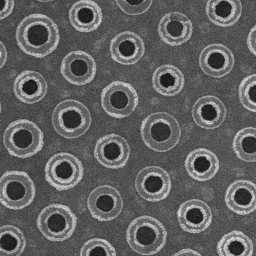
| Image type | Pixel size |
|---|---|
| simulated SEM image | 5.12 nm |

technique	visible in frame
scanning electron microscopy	a regular array of ring-shaped raised bodies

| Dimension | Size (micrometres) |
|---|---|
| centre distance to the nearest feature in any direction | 0.264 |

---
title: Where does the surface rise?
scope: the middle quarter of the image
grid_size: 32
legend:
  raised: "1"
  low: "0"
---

11000011000000000000000011100000
11000011000000000000000111111000
11000111000000000000001110011000
11111110000000000000001100001100
00111100000001000000001100001100
00000000000111111000001110011100
00000000001111111100000111111000
00000000011100011100000011110000
00000000011100001100000000000000
11100000011100001100000000000000
11111000001100001100000000000000
11111100001111111000000000000000
00001100000111111000001111000000
00001110000000000000011111110000
00001110000000000000111111110000
00001100000000000001110000111000
11111100000000000001110000011000
11111000000000000001110000011000
01000000011111100000110000111000
00000000111111110000111111110000
00000000110000110000011111110000
00000000110000110000000111000000
10000000110000110000000000000001
11100000111001110000000000000001
01110000011111110000000000000011
00111000001111100000000000000011
00111000000000000001111110000001
00111000000000000011111111000001
01110000000000000011100011000000
11110000000000000011000001100000
11100000000000000011000001100000
00000000111110000011100011000000